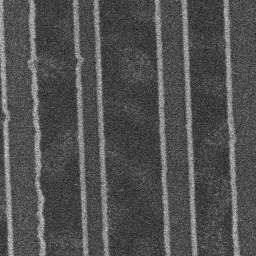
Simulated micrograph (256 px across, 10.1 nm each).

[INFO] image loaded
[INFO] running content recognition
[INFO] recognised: one or a few lines or trenches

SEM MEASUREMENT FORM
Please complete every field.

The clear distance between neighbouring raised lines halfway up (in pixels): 27.2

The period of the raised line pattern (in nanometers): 762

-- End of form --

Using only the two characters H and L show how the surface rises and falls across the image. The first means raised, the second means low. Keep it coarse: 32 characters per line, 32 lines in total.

LLLLHHHHHLLLHHHHHHHHLLLHHHHHLLLL
LLLLHHHHHLLLHHHHHHHHLLLHHHHHLLLL
LLLLHHHHHLLLHHHHHHHHLLLHHHHHLLLL
LLLLHHHHHHLLHHHHHHHHLLLHHHHHLLLL
LLLLHHHHHHLLHHHHHHHHLLLHHHHHLLLL
LLLLHHHHHHLLHHHHHHHHLLLHHHHHHLLL
LLLLHHHHHHLLHHHHHHHHLLLHHHHHLLLL
LLLLHHHHHHLLHHHHHHHHLLLHHHHHHLLL
LLLLHHHHHHLLHHHHHHHHLLLHHHHHHLLL
LLLLHHHHHHLLHHHHHHHHLLLHHHHHHLLL
LLLLHHHHHHLLHHHHHHHHLLLHHHHHHLLL
LLLLHHHHHHLLHHHHHHHHLLLHHHHHHLLL
HLLLHHHHHHLLLHHHHHHHLLLLHHHHHLLL
HLLLHHHHHHLLLHHHHHHHLLLLHHHHHLLL
HLLLHHHHHHLLLHHHHHHHLLLLHHHHHLLL
HLLLLHHHHHLLLHHHHHHHLLLLHHHHHLLL
HLLLLHHHHHLLLHHHHHHHLLLLHHHHHLLL
HLLLLHHHHHLLLHHHHHHHLLLLHHHHHLLL
HLLLLHHHHHLLLHHHHHHHLLLLHHHHHLLL
HLLLLHHHHHLLLHHHHHHHLLLLHHHHHLLL
HLLLLHHHHHLLLHHHHHHHLLLLHHHHHLLL
HLLLLHHHHHLLLHHHHHHHHLLLHHHHHLLL
HLLLLHHHHHLLLHHHHHHHHLLLHHHHHLLL
HLLLLHHHHHLLLHHHHHHHHLLLHHHHHLLL
HLLLLHHHHHLLLHHHHHHHHLLLHHHHHLLL
HLLLLHHHHHLLLHHHHHHHHLLLHHHHHLLL
HLLLLHHHHHLLLHHHHHHHHLLLHHHHHLLL
HLLLLHHHHHHLLHHHHHHHHLLLHHHHHLLL
HLLLLHHHHHHLLHHHHHHHHLLLHHHHHLLL
HLLLLHHHHHHLLHHHHHHHHLLLHHHHHLLL
HLLLLHHHHHHLLHHHHHHHHLLLHHHHHLLL
HLLLLHHHHHHLLHHHHHHHHLLLHHHHHHLL